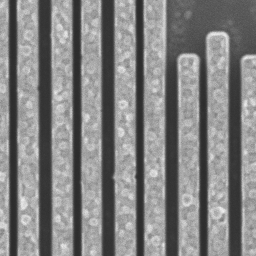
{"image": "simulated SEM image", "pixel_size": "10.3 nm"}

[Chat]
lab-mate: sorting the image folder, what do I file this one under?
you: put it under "parallel lines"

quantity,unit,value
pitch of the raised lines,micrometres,0.327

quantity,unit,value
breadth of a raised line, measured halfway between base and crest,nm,220